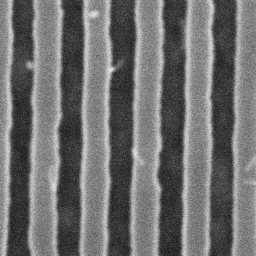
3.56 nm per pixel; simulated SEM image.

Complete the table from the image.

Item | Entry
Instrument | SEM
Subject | lines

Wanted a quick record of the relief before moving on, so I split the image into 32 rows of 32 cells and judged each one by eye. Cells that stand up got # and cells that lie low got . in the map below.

#...###....###...###....###...##
#...####...###...###...####...##
#...####...###...###...###....##
#...####...###...###...###....##
##..####...###...###...###....##
#...####...###...###...####...##
#...###....###...###...####...##
#...###....###...###...####...##
#...###....###...###...###....##
#...###....###...###...###....##
#...###....###...###...###...###
#...###....###...###...###...###
#...###...###....###...###...###
#...###...####...###...###...###
#...####..####...###...###...###
#...###...###....###...###...###
#...###...####...###...###...###
#...###....###...###...###...###
#...###...####...###...###...###
#...###...####...###...###...###
#...###...####...###...###...###
#...###...####...###...###...###
#...###...####...###...###...###
#...###...####..####...###...###
#...###...####..####...###...###
#...###...###...####...###...###
#...###...###...####...###...###
#...###...###...####...###...###
#...###...###...####...###...###
#...###...###...####...###...###
#...###...###...####...###...###
#...###...###....###...###...###